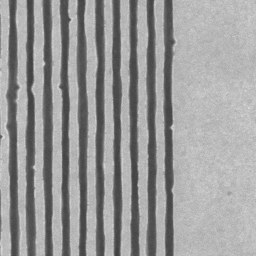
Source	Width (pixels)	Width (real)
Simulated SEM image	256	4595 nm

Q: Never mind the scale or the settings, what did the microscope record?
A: parallel lines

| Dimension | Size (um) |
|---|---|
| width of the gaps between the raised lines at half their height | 0.141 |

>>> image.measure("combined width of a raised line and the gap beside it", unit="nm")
310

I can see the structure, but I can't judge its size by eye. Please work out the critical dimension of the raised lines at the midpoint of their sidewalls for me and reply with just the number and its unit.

0.177 microns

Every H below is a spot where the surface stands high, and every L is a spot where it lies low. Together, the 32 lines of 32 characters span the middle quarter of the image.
LHHLLLHHLLHHLLHHLLHHHLLHHLLHHHHH
LHHLLLHHLLHHLLHHLLHHHLLHHLLHHHHH
LHHLLLHHLLHHLLHHLLLHHLLHHLLHHHHH
LHHLLLHHLLHHLLHHLLLHHLLHHLLHHHHH
LHHLLLHHLLHHLLHHLLLHHLLHHLLHHHHH
LHHLLLHHLLHHLLLHLLHHHLLHHLLHHHHH
LHHHLLHHLLHHLLLHLLHHHLLHHLLHHHHH
LHHLLLHHLLHHLLLHLLHHHLLHHLLHHHHH
LHHHLLHHLLHHLLLHLLHHHLLHHLLHHHHH
LHHHLLHHLLHHLLHHLLHHHLLHHLLHHHHH
LHHLLLHHLLHHLLHHLLHHHLLHHLLHHHHH
LHHLLLHHLLHHLLHHLLHHHLLHHLLHHHHH
LHHLLLHHLLHHLLHHLLHHHLLHHLLHHHHH
LHHLLLHHLLHHLLHHHLHHHLLHHLLHHHHH
LHHLLLHHLLHHLLHHHLHHHLLHHLLHHHHH
LHHHLLHHLLHHLLHHHLHHHLLHHLLHHHHH
LHHHLLHHLLHHLLHHHLHHHLLHHLLHHHHH
LHHHLLHHLLHHLLHHHLHHHLLHHLLHHHHH
LHHLLLHHLLHHLLHHHLLHHLLHHLLHHHHH
LHHLLLHHLLHHLLHHHLLHHLLHHLLHHHHH
LHHHLLHHLLHHLLHHHLLHHLLHHLLHHHHH
LHHHLLHHLLHHLLHHHLLHHLLHHLLHHHHH
LHHHLLHHLLHHLLHHHLLHHLLHHLLHHHHH
LHHHLLHHLLHHLLHHHLLHHLLHHLLHHHHH
LHHHLLHHLLHHLLHHHLLHHLLHHLLHHHHH
LHHHLLHHLLHHHLHHHLLHHLLHHLLHHHHH
LHHHLLHHLLHHLLHHHLLHHLLHHLLHHHHH
LHHHLLHHLLHHLLHHHLLHHLLHHLLHHHHH
LHHHLLHHLLHHLLHHHLLHHLLHHLLHHHHH
LHHHLLHHLLHHLLHHHLLHHLLHHLLHHHHH
LHHHLLHHLLHHLLLHHLLHHLLHHLLHHHHH
LHHHLLHHLLHHLLLHHLLHHLLHHLLHHHHH